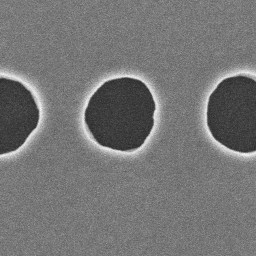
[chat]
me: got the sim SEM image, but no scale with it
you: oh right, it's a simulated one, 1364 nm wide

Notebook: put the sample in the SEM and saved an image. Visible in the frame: holes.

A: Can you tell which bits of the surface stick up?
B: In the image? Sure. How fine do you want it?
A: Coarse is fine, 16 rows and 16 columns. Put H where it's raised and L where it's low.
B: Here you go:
HHHHHHHHHHHHHHHH
HHHHHHHHHHHHHHHH
HHHHHHHHHHHHHHHH
HHHHHHHHHHHHHHHH
HHHHHHHHHHHHHHHH
LLHHHHLLLHHHHLLL
LLHHHHLLLLHHHLLL
LLHHHLLLLLHHHLLL
LLHHHHLLLHHHHLLL
LHHHHHHHHHHHHHHH
HHHHHHHHHHHHHHHH
HHHHHHHHHHHHHHHH
HHHHHHHHHHHHHHHH
HHHHHHHHHHHHHHHH
HHHHHHHHHHHHHHHH
HHHHHHHHHHHHHHHH